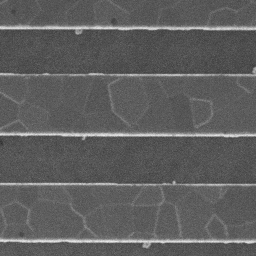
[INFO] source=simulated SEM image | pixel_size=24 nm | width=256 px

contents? lines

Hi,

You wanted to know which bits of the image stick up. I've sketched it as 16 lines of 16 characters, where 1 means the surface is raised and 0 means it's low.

1111111111111111
1111111111111111
0000000000000000
0000000000000000
0000000000000000
1111111111111111
1111111111111111
1111111111111111
0000000000000010
0000000000000000
0000000000000000
1111111100100000
1111111111111111
1111111111111111
1111111111111111
0000000000000000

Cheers